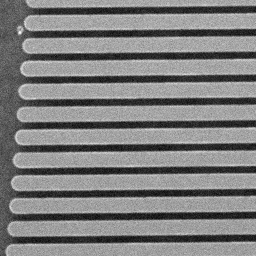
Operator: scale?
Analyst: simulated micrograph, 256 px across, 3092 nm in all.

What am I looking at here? groups of lines, slits or small figures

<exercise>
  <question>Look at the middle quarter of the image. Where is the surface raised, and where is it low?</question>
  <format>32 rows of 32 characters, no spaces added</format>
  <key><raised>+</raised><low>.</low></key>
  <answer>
++++++++++++++++++++++++++++++++
++++++++++++++++++++++++++++++++
++++++++++++++++++++++++++++++++
................................
................................
++++++++++++++++++++++++++++++++
++++++++++++++++++++++++++++++++
++++++++++++++++++++++++++++++++
++++++++++++++++++++++..........
................................
................................
++++++++++++++++++++++++++++++++
++++++++++++++++++++++++++++++++
++++++++++++++++++++++++++++++++
................................
................................
++++++++++++++++++++++++++++++++
++++++++++++++++++++++++++++++++
++++++++++++++++++++++++++++++++
++++++++++++++++++++++++++++++++
................................
................................
++++++++++++++++++++++++++++++++
++++++++++++++++++++++++++++++++
++++++++++++++++++++++++++++++++
+++++++++++++++++++++++++.......
................................
................................
++++++++++++++++++++++++++++++++
++++++++++++++++++++++++++++++++
++++++++++++++++++++++++++++++++
................................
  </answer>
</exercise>